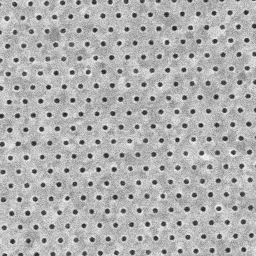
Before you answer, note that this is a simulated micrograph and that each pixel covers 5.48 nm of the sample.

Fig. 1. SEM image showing a regular array of holes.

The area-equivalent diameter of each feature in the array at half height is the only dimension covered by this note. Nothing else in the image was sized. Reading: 30.3 nanometres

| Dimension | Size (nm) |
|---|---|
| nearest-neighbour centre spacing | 85.4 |